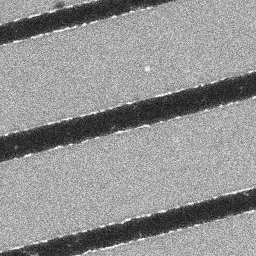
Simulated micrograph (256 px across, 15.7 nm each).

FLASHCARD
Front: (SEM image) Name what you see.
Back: one or a few lines or trenches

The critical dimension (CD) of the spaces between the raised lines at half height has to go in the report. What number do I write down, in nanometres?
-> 1340